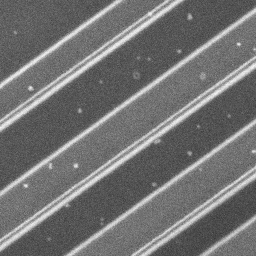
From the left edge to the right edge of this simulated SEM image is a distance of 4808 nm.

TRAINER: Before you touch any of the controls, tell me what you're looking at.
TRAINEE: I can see lines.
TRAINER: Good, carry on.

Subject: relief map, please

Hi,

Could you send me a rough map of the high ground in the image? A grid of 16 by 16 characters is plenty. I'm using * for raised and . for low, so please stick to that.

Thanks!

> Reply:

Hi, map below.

.......***......
.....****......*
....****.....***
...***......****
.****......****.
****.....*****..
**......*****...
*......****.....
.....*****.....*
....****.....***
..*****.....****
.*****.....****.
****.....*****..
***.....****....
*.....*****....*
.....*****...***